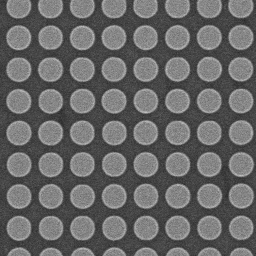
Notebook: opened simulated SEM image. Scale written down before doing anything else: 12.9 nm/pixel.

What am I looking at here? an array of small figures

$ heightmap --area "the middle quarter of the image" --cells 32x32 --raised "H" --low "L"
LLHHHHHLLLHHHHHLLLHHHHHLLLHHHHHL
LLHHHHHHLHHHHHHLLLHHHHHLLHHHHHHL
LLHHHHHLLLHHHHHLLLHHHHHLLLHHHHHL
LLHHHHHLLLHHHHHLLLHHHHHLLLHHHHLL
LLLLLLLLLLLLLLLLLLLLLLLLLLLLLLLL
LLLLLLLLLLLLLLLLLLLLLLLLLLLLLLLL
LLLHHHLLLLLHHHLLLLLHHHLLLLLHHLLL
LLHHHHHLLLHHHHHLLLHHHHHLLLHHHHHL
LLHHHHHHLHHHHHHLLLHHHHHLLLHHHHHL
LLHHHHHHLHHHHHHLLLHHHHHLLHHHHHHL
LLHHHHHLLLHHHHHLLLHHHHHLLLHHHHHL
LLLHHHHLLLHHHHHLLLHHHHHLLLHHHHLL
LLLLLLLLLLLLLLLLLLLLLLLLLLLLLLLL
LLLLLLLLLLLLLLLLLLLLLLLLLLLLLLLL
LLLHHHLLLLLHHHLLLLLHHHLLLLLHHHLL
LLHHHHHLLLHHHHHLLLHHHHHLLLHHHHHL
LLHHHHHLLLHHHHHLLLHHHHHLLHHHHHHL
LLHHHHHLLLHHHHHLLLHHHHHLLHHHHHHL
LLHHHHHLLLHHHHHLLLHHHHHLLLHHHHHL
LLLHHHLLLLLHHHHLLLHHHHLLLLLHHHLL
LLLLLLLLLLLLLLLLLLLLLLLLLLLLLLLL
LLLLLLLLLLLLLLLLLLLLLLLLLLLLLLLL
LLLHHHLLLLLHHHLLLLLHHHLLLLLHHHLL
LLHHHHHLLLHHHHHLLLHHHHHLLLHHHHHL
LLHHHHHLLLHHHHHLLLHHHHHHLLHHHHHL
LLHHHHHLLLHHHHHLLLHHHHHHLLHHHHHL
LLHHHHHLLLHHHHHLLLHHHHHLLLHHHHHL
LLLHHHLLLLLHHHHLLLLHHHLLLLLHHHLL
LLLLLLLLLLLLLLLLLLLLLLLLLLLLLLLL
LLLLLLLLLLLLLLLLLLLLLLLLLLLLLLLL
LLLHHHLLLLLHHHLLLLLHHHLLLLLHHHLL
LLHHHHHLLLHHHHHLLLHHHHHLLLHHHHHL